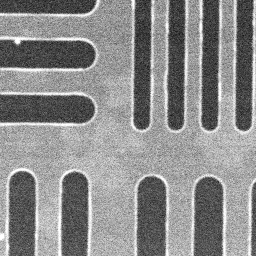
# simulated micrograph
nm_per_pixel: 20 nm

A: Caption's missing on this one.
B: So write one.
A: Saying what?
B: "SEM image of groups of lines, slits or small figures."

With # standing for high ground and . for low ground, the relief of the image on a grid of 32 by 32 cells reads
............#####..##..##...#...
...........######..##..##...#...
#################..##..##...#...
#################..##..##...#...
#################..##..##...#...
...........######..##..##...#...
............#####..##..##..##...
............#####..##..##..##...
...........######..##..##..##...
#################..##..##..##...
#################..##..##..##...
#################..##..##..##...
............#####..##..##..##...
............#####..##..##..##...
............####...##..##..##...
.####.....#######..##..##..##...
################################
################################
################################
################################
################################
##..#####.######################
#...####...#######..#####..#####
#....###...######....###....###.
#....###...######....###....###.
#....###...######....###....###.
#....##....######....###....###.
#....##....######....###....###.
#....##....######....###....###.
#....##....######....###....###.
#....##....######....###....###.
#....##....######....###....###.